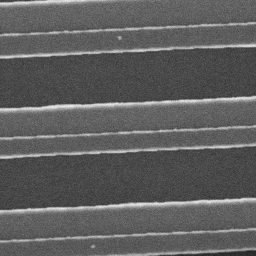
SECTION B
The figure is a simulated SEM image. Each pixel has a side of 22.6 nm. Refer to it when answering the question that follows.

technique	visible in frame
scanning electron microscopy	lines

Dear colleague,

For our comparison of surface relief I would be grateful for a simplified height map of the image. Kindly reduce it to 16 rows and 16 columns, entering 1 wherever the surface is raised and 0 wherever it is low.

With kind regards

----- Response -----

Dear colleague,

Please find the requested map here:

1111111111111111
1111111111111111
1111111111111111
1000000000000000
0000000000000000
0000000000000000
0000000011111111
1111111111111111
1111111111111111
1111111000000000
0000000000000000
0000000000000000
0000000000000001
1111111111111111
1111111111111111
1111111111111111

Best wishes